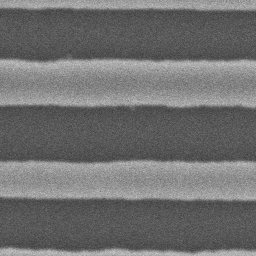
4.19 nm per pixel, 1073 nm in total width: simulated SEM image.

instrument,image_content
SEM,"lines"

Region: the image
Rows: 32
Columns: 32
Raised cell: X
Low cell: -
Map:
XXXXXXXXXXXXXXXXXXXXXXXXXXXXXXXX
--------------------------------
--------------------------------
--------------------------------
--------------------------------
--------------------------------
--------------------------------
--------------------------------
XXXXXXXXXXXXXXXXXXXXXXXXXXXXXXXX
XXXXXXXXXXXXXXXXXXXXXXXXXXXXXXXX
XXXXXXXXXXXXXXXXXXXXXXXXXXXXXXXX
XXXXXXXXXXXXXXXXXXXXXXXXXXXXXXXX
XXXXXXXXXXXXXXXXXXXXXXXXXXXXXXXX
--------------------------------
--------------------------------
--------------------------------
--------------------------------
--------------------------------
--------------------------------
--------------------------------
XXXXXXXXXXXXXXXXXXXXXXXXXXXXXXXX
XXXXXXXXXXXXXXXXXXXXXXXXXXXXXXXX
XXXXXXXXXXXXXXXXXXXXXXXXXXXXXXXX
XXXXXXXXXXXXXXXXXXXXXXXXXXXXXXXX
XXXXXXXXXXXXXXXXXXXXXXXXXXXXXXXX
--------------------------------
--------------------------------
--------------------------------
--------------------------------
--------------------------------
--------------------------------
XXXXXXXXXXXXXXXXXXXXXX---X-XXXXX